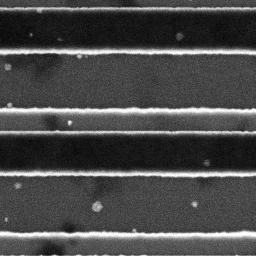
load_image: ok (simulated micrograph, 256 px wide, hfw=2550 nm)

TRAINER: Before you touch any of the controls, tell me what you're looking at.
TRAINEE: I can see lines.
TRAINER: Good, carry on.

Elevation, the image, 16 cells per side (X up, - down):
XXXXXXXXXXXXXXXX
XXXXXXXXXXXXXXXX
XXXXXXXXXXXXXXXX
----------------
----------------
----------------
----------------
XXXXXXXXXXXXXXXX
XXXXXXXXXXXXXXXX
XXXXXXXXXXXXXXXX
XXXXXXXXXXXXXXXX
----------------
----------------
----------------
----------------
XXXXXXXXXXXXXXXX